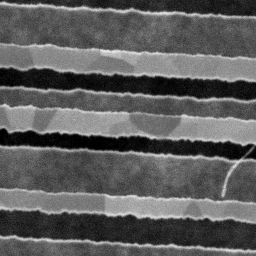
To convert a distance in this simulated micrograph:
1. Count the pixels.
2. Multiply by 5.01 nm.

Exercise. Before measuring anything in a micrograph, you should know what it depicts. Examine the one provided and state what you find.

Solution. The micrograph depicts lines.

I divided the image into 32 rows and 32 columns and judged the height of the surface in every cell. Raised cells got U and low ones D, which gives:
UDDDDDDDDDDDDDDDDDDDDDDDDDDDDDDD
UUUUUUUUUUUUUUUUUUDDDDDDDDDDDDDD
UUUUUUUUUUUUUUUUUUUUUUUUUUUUUUUU
UUUUUUUUUUUUUUUUUUUUUUUUUUUUUUUU
UUUUUUUUUUUUUUUUUUUUUUUUUUUUUUUU
UUUUUUUUUUUUUUUUUUUUUUUUUUUUUUUU
UUUUUUUUUUUUUUUUUUUUUUUUUUUUUUUU
UUUUUUUUUUUUUUUUUUUUUUUUUUUUUUUU
DDUUDDUUUUUUUUUUUUUUUUUUUUUUUUUU
DDDDDDDDDDDDDDDDDDDDUUUUUUUUUUUU
DDDDDDDDDDDDDDDDDDDDDDDDDDDDDDDD
UUUUUUUUUUUUDDDDDDDDDDDDDDDDDDDD
UUUUUUUUUUUUUUUUUUUUUUUUUUUUUUDD
UUUUUUUUUUUUUUUUUUUUUUUUUUUUUUUU
UUUUUUUUUUUUUUUUUUUUUUUUUUUUUUUU
UUUUUUUUUUUUUUUUUUUUUUUUUUUUUUUU
DUDDDUUUUUUUUUUUUUUUUUUUUUUUUUUU
DDDDDDDDDDDDDDDDDDDDDDDDUUUUUUUU
UUUUUUUDDDDDDDDDDDDDDDDDDDDDDDDD
UUUUUUUUUUUUUUUUUUUUUUDDDDDDDDDD
UUUUUUUUUUUUUUUUUUUUUUUUUUUUUUUU
UUUUUUUUUUUUUUUUUUUUUUUUUUUUUUUU
UUUUUUUUUUUUUUUUUUUUUUUUUUUUUUUU
UUUUUUUUUUUUUUUUUUUUUUUUUUUUUUUU
UUUUUUUUUUUUUUUUUUUUUUUUUUUUUUUU
UUUUUUUUUUUUUUUUUUUUUUUUUUUUUUUU
DDDDDDUUDUUUUUUUUUUUUUUUUUUUUUUU
DDDDDDDDDDDDDDDDDDDDDDDDDDDDDDUU
DDDDDDDDDDDDDDDDDDDDDDDDDDDDDDDD
DDDDDDDDDDDDDDDDDDDDDDDDDDDDDDDD
UUUUUUUUUUUUUUUDDDDDDDDDDDDDDDDD
UUUUUUUUUUUUUUUUUUUUUUUUUUUUUUUU